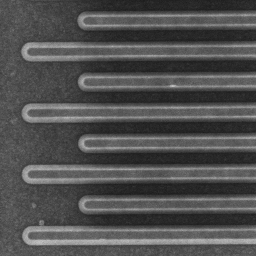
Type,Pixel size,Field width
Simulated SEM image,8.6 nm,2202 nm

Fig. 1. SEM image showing groups of lines, slits or small figures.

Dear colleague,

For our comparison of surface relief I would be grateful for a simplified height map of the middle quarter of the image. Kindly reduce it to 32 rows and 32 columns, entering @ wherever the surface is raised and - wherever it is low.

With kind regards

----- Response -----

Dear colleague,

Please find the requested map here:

--------------------------------
--------------------------------
--------------------------------
----@@@@@@@@@@@@@@@@@@@@@@@@@@@@
----@@@@@@@@@@@@@@@@@@@@@@@@@@@@
----@@@@@@@@@@@@@@@@@@@@@@@@@@@@
--------------------------------
--------------------------------
--------------------------------
--------------------------------
--------------------------------
@@@@@@@@@@@@@@@@@@@@@@@@@@@@@@@@
@@@@@@@@@@@@@@@@@@@@@@@@@@@@@@@@
@@@@@@@@@@@@@@@@@@@@@@@@@@@@@@@@
--------------------------------
--------------------------------
--------------------------------
--------------------------------
-----@@@@@@@@@@@@@@@@@@@@@@@@@@@
----@@@@@@@@@@@@@@@@@@@@@@@@@@@@
----@@@@@@@@@@@@@@@@@@@@@@@@@@@@
------@@@-----------------------
--------------------------------
--------------------------------
--------------------------------
--------------------------------
@@@@@@@@@@@@@@@@@@@@@@@@@@@@@@@@
@@@@@@@@@@@@@@@@@@@@@@@@@@@@@@@@
@@@@@@@@@@@@@@@@@@@@@@@@@@@@@@@@
--------------------------------
--------------------------------
--------------------------------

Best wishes